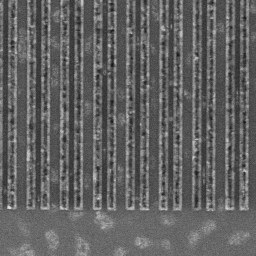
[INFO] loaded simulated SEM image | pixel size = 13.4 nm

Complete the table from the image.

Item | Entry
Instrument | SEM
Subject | parallel lines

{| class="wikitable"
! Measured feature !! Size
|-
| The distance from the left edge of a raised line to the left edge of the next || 0.221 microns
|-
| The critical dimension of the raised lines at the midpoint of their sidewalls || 83.5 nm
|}